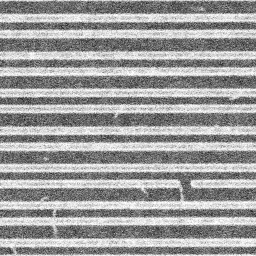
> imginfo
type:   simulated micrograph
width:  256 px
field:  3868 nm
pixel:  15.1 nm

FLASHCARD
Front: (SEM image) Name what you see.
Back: parallel lines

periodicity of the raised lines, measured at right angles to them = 283 nanometers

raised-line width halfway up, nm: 90.7